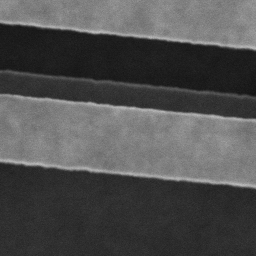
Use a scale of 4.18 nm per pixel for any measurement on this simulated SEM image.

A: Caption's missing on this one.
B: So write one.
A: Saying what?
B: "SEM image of lines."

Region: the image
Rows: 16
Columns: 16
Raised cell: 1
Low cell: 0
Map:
1111111111111111
0111111111111111
0000000000111111
0000000000000000
1000000000000000
1111111111100000
1111111111111111
1111111111111111
1111111111111111
1111111111111111
0000111111111111
0000000000000011
0000000000000000
0000000000000000
0000000000000000
0000000000000000